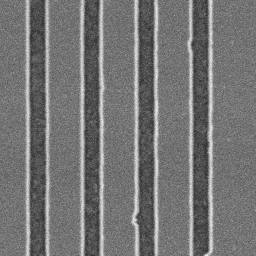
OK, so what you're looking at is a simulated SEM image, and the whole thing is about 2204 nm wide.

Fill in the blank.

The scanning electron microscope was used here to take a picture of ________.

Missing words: parallel lines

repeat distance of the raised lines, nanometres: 468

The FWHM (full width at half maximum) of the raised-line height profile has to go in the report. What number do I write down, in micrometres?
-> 0.313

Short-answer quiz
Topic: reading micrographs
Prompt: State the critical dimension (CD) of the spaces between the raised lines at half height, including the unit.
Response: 0.156 microns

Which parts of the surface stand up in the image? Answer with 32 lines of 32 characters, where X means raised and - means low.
XXXX--XXXX---XXXX--XXXXX--XXXXXX
XXXX--XXXX---XXXX---XXXX--XXXXXX
XXXX--XXXX---XXXX---XXXX--XXXXXX
XXXX--XXXX---XXXX--XXXXX--XXXXXX
XXXX--XXXX---XXXX--XXXXX--XXXXXX
XXXX--XXXX---XXXX--XXXXX--XXXXXX
XXXX--XXXX---XXXX--XXXXX--XXXXXX
XXXX--XXXX---XXXX--XXXXX--XXXXXX
XXXX--XXXX---XXXX--XXXXX--XXXXXX
XXXX--XXXX---XXXX--XXXXX--XXXXXX
XXXX--XXXX---XXXX--XXXXX--XXXXXX
XXXX--XXXX---XXXX--XXXXX--XXXXXX
XXXX--XXXX---XXXX--XXXXX--XXXXXX
XXXX--XXXX---XXXX--XXXXX--XXXXXX
XXXX--XXXX---XXXX--XXXXX--XXXXXX
XXXX--XXXX---XXXX---XXXX--XXXXXX
XXXX--XXXX---XXXX--XXXXX--XXXXXX
XXXX--XXXX---XXXX--XXXXX--XXXXXX
XXXX--XXXX---XXXX--XXXXX--XXXXXX
XXXX--XXXX---XXXX--XXXXX--XXXXXX
XXXX--XXXX---XXXX---XXXX--XXXXXX
XXXX--XXXX---XXXX--XXXXX--XXXXXX
XXXX--XXXX---XXXX--XXXXX--XXXXXX
XXXX--XXXX---XXXX--XXXXX--XXXXXX
XXXX--XXXX---XXXX--XXXXX--XXXXXX
XXXX--XXXX---XXXX--XXXXX--XXXXXX
XXXX--XXXX---XXXX--XXXXX--XXXXXX
XXXX--XXXX---XXXX---XXXX--XXXXXX
XXXX--XXXX---XXXX--XXXXX--XXXXXX
XXXX--XXXX---XXXX--XXXXX--XXXXXX
XXXX--XXXX---XXXX--XXXXX--XXXXXX
XXXX--XXXX---XXXX--XXXXX--XXXXXX